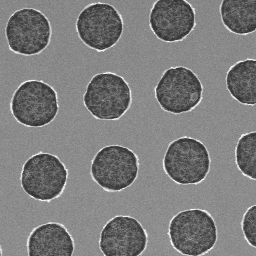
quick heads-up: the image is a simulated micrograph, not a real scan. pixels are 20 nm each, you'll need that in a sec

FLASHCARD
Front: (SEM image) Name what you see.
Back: a regular array of holes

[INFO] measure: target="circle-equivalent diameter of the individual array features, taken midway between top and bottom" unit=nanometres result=907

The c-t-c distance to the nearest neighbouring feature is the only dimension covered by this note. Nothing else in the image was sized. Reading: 1.43 micrometres